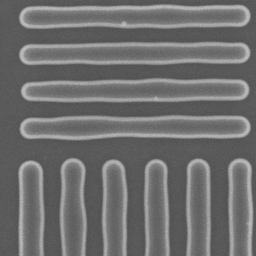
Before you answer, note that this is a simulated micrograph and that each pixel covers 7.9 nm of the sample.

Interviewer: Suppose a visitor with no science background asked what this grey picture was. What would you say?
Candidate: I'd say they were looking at groups of lines, slits or small figures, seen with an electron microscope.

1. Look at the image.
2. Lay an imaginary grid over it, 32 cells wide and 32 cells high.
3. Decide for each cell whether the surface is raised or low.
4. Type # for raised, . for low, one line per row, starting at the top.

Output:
................................
...############################.
...############################.
................................
................................
................................
...############################.
...############################.
................................
................................
.....##########################.
...############################.
................................
................................
................................
...############################.
...############################.
................................
................................
................................
...##...##...##....#....##...##.
...##...##...##...###...##...##.
...##...##...##...###...##...##.
...##...##...###..###...##...##.
...##...##...###..###..###...##.
...##...##...###..###..###...##.
...##...###..###..###..###...##.
...##...###..###..###...##...##.
...##...###..###..###...##...##.
...##...###..###..###...##...##.
...##...###..###..###...##...##.
...##...##...###..###...##...##.